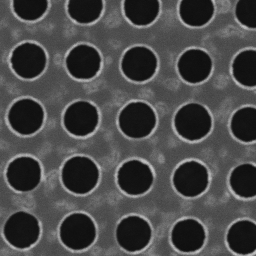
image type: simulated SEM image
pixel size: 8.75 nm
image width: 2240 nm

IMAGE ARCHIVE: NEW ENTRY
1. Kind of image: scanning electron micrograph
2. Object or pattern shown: a regular array of holes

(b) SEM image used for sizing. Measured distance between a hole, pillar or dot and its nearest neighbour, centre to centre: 484 nm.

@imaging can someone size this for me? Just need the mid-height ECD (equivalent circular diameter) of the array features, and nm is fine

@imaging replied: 309